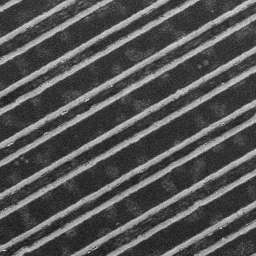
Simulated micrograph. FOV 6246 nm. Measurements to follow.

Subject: parallel lines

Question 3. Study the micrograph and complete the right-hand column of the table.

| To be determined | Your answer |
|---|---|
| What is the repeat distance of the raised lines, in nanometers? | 1090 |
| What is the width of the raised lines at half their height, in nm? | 394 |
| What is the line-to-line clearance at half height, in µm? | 0.687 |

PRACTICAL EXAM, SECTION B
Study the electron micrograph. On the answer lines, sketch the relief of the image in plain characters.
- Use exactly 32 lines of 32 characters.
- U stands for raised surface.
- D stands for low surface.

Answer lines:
UDDDDDDDUUUUUDDDDDDDUUUUDDDDDDDU
DDDDDDUUUUUDDDDDDDUUUUDDDDDDDUUU
DDDDDUUUUDDDDDDDUUUUDDDDDDDUUUUD
DDDUUUUUDDDDDDUUUUDDDDDDDDUUUDDD
DUUUUUDDDDDDDUUUUDDDDDDDUUUUDDDD
UUUUDDDDDDDUUUUDDDDDDDUUUUDDDDDD
UUDDDDDDDUUUUDDDDDDDUUUUDDDDDDDU
DDDDDDDUUUUDDDDDDDDUUUUDDDDDDDUU
DDDDDDUUUUDDDDDDDUUUUDDDDDDDUUUU
DDDDUUUUDDDDDDDUUUUDDDDDDDUUUUDD
DDUUUUDDDDDDDDUUUDDDDDDDUUUUUDDD
DUUUUDDDDDDDUUUUDDDDDDDUUUUDDDDD
UUUDDDDDDDUUUUDDDDDDDUUUUDDDDDDD
UDDDDDDDUUUUDDDDDDDUUUUDDDDDDDDU
DDDDDDDUUUDDDDDDDUUUUUDDDDDDDUUU
DDDDDUUUUDDDDDDDUUUUDDDDDDDUUUUD
DDDUUUUDDDDDDDUUUUDDDDDDDUUUUDDD
DUUUUDDDDDDDUUUUUDDDDDDDUUUDDDDD
UUUUDDDDDDUUUUUDDDDDDDUUUUDDDDDD
UUDDDDDDDUUUUDDDDDDDUUUUDDDDDDDU
DDDDDDDUUUUDDDDDDDDUUUDDDDDDDUUU
DDDDDUUUUUDDDDDDDUUUUDDDDDDDUUUU
DDDDUUUUDDDDDDDUUUUDDDDDDDUUUUDD
DDUUUUDDDDDDDUUUUDDDDDDDUUUUUDDD
UUUUDDDDDDDDUUUDDDDDDDUUUUUDDDDD
UUUDDDDDDDUUUDDDDDDDDUUUUDDDDDDD
UDDDDDDDUUUUDDDDDDDUUUUDDDDDDDUU
DDDDDDUUUUDDDDDDDUUUUUDDDDDDDUUU
DDDDDUUUDDDDDDDUUUUUDDDDDDDUUUUD
DDDUUUDDDDDDDDUUUUDDDDDDDUUUUDDD
DUUUUDDDDDDDUUUUDDDDDDDUUUUDDDDD
UUUDDDDDDDUUUUUDDDDDDDUUUUDDDDDD